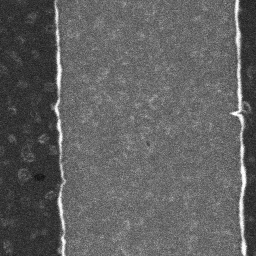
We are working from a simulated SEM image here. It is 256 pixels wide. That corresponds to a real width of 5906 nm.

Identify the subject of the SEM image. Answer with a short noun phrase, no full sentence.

one or a few lines or trenches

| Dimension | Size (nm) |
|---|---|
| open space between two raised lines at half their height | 4150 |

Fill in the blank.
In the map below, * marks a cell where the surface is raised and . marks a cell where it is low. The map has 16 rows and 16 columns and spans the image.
****...........*
****...........*
****...........*
****...........*
****...........*
****...........*
****...........*
****...........*
****...........*
****...........*
****...........*
****...........*
****...........*
****...........*
****...........*
****...........*